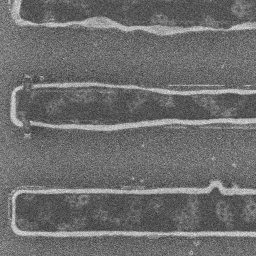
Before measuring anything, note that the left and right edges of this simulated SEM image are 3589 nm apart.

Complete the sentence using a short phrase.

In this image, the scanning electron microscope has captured one or a few lines or trenches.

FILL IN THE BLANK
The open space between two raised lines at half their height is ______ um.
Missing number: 0.887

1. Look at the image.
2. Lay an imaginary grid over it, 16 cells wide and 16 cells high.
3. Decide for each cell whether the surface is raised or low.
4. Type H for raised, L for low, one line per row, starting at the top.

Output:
LHHHHHHHHHHHHHHH
LLHHLLLHHHHHHHHH
LLLLLLLLLLLLLLLL
LLLLLLLLLLLLLLLL
LLLLLLLLLLLLLLLL
LHHHHHHHHLLLLLLL
LHHHHHHHHHHHHHHH
LHHHHHHHHHHHHHHH
LLLLLLLLLLLLLLLL
LLLLLLLLLLLLLLLL
LLLLLLLLLLLLLLLL
LLLLLLLLLLLLLLLL
LHHHHHHHHHHHHHHH
LHHHHHHHHHHHHHHH
LHHHHHHHHHHHHHHH
LLLLLLLLLLLLLLLL